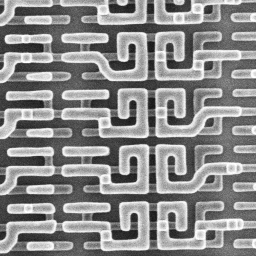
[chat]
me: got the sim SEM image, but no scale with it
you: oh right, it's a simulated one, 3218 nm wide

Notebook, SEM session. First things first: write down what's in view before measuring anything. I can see wiring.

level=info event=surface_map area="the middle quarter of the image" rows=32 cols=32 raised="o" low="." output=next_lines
.........oo.......ooo..ooo......
.........ooo....ooooo..ooooooooo
..........ooooooooooo..ooooooooo
..........ooooooooooo..ooooooooo
................................
................................
..............ooooooo..ooooooo..
ooooooooooo..oooooooo..ooooooo..
ooooooooooo..oooooooo..ooooooo..
..............oo..ooo..ooo.ooo..
..............oo..ooo..ooo..oo..
ooooooooooo...oo..ooo..ooo..oo..
ooooooooooo...oo..ooo..ooo..oo..
ooooooooooo...oo..ooo..ooo......
.........ooo......ooo..ooo......
.........ooo.....oooo..ooooooooo
.........oooooooooooo..ooooooooo
.........oooooooooooo..ooooooooo
................................
................................
.................oooo..ooooooo..
ooooooooooo...ooooooo..ooooooo..
ooooooooooo...ooooooo..ooooooo..
..............oo..ooo..ooo..oo..
..............oo...oo..ooo..oo..
ooooooooooo...oo...oo..ooo..oo..
ooooooooooo...oo...oo..ooo..oo..
oooooooooooo..oo...oo..ooo..oo..
.........ooo.......oo..ooo......
.........ooo......ooo..ooooooooo
.........oooooooooooo..ooooooooo
.........oooooooooooo..ooooooooo